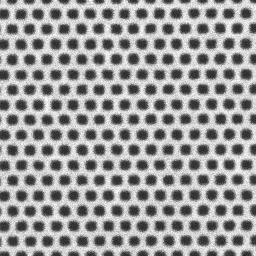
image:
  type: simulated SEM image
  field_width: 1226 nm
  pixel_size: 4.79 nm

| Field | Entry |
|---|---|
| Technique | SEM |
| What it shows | a regular array of holes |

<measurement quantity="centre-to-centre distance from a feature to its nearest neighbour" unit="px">17.1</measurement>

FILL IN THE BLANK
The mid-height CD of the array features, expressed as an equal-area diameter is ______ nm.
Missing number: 58.7